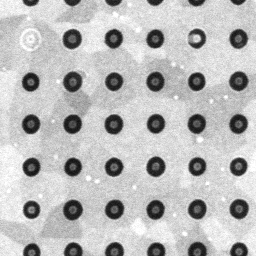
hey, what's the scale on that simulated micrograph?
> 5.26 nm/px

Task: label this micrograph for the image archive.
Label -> a regular array of ring-shaped grooves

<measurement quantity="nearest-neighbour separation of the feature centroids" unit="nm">218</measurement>